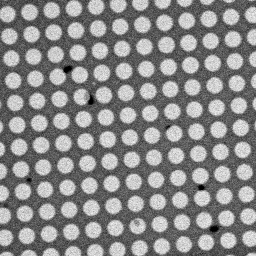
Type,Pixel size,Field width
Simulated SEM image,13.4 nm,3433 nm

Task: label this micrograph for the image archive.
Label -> an array of small figures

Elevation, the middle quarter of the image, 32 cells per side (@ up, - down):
---------@----@@---@@@--@@@@--@@
---@@---@@@--@@@@--@@@--@@@@--@@
--@@@@--@@@--@@@@--@@@---@@-----
--@@@@--@@@---@@----------------
---@@---------------------@----@
---------------@----@@---@@@--@@
----@----@@---@@@--@@@@--@@@--@@
---@@@--@@@@--@@@--@@@@--@@@---@
@--@@@--@@@@--@@@---@@----------
@--@@@---@@---------------------
--------------------------@@---@
---------------@@---@@@--@@@@--@
----@@---@@@--@@@@--@@@--@@@@--@
@--@@@@--@@@--@@@@--@@@---@@----
@--@@@@--@@@---@@---------------
@---@@--------------------------
----------------@----@@---@@@--@
-----@----@@---@@@--@@@@--@@@--@
@---@@@--@@@@--@@@--@@@@--@@@---
@@-@@@@--@@@@--@@@---@@---------
@@--@@@---@@--------------------
@--------------------------@@---
----------------@@---@@@--@@@@--
-----@@---@@@--@@@@--@@@--@@@@--
@@--@@@@--@@@--@@@@--@@@---@@---
@@--@@@@--@@@---@@--------------
@@---@@-------------------------
----------------------@@---@@@--
-----------@@---@@@--@@@@--@@@--
@@---@@@--@@@@--@@@--@@@@--@@@--
@@@--@@@--@@@@--@@@---@@--------
@@@--@@@---@@-------------------